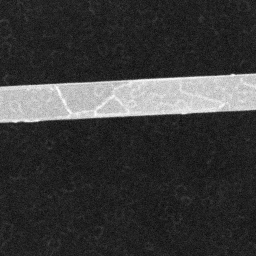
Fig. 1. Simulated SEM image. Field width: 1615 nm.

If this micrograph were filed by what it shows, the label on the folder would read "one or a few lines or trenches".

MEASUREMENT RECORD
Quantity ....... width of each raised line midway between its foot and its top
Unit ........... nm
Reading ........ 224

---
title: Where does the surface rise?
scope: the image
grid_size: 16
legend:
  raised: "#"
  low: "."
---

................
................
................
................
................
################
################
###.............
................
................
................
................
................
................
................
................